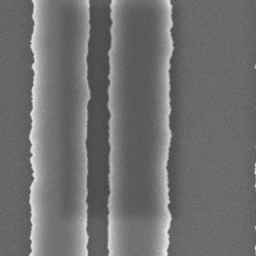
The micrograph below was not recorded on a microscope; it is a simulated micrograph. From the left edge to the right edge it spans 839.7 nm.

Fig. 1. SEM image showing lines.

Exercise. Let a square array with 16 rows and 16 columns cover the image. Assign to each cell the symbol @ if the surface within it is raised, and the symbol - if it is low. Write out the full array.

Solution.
--@@@@@@@@@-----
--@@@@@@@@@-----
--@@@@@@@@@-----
--@@@@@@@@@-----
--@@@@@@@@@-----
--@@@@@@@@@-----
--@@@@@@@@@-----
--@@@@@@@@@-----
--@@@@@@@@@-----
--@@@@@@@@------
--@@@@@@@@------
--@@@@@@@@------
--@@@@@@@@------
--@@@@@@@@@-----
--@@@@@@@@------
--@@@@@@@@------